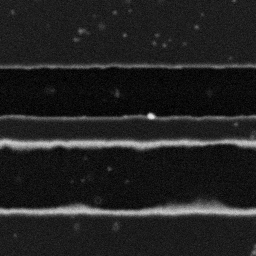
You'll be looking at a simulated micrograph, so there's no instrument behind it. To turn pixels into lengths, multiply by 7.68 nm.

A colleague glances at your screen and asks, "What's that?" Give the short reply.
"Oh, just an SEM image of lines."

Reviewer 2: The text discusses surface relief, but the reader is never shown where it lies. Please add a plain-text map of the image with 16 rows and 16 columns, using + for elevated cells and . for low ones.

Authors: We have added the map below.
++++++++++++++++
++++++++++++++++
++++++++++++++++
++++++++++++++++
................
................
................
++++++++++++++++
++++++++++++++++
................
................
................
................
++++++++++++++++
++++++++++++++++
++++++++++++++++